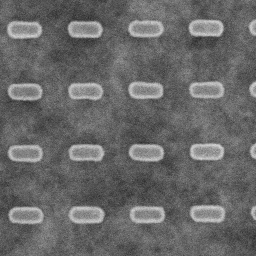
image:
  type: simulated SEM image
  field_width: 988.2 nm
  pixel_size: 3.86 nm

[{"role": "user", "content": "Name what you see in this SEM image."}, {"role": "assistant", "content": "a regular array of raised bodies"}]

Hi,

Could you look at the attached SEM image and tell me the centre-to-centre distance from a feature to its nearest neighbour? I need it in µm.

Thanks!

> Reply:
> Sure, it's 0.233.